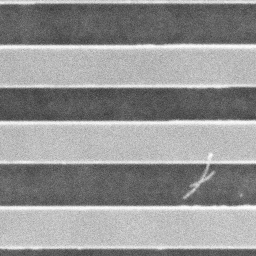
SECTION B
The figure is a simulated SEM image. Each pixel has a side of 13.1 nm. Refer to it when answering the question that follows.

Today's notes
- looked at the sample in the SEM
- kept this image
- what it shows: lines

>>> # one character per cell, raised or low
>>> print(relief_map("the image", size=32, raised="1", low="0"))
00000000000000000000000000000000
00000000000000000000000000000000
00000000000000000000000000000000
00000000000000000000000000000000
00000000000000000000000000000000
00000000000000000000000000000000
11111111111111111111111111111111
11111111111111111111111111111111
11111111111111111111111111111111
11111111111111111111111111111111
11111111111111111111111111111111
00000000000000000000000000000000
00000000000000000000000000000000
00000000000000000000000000000000
00000000000000000000000000000000
11111111111111111111111111111111
11111111111111111111111111111111
11111111111111111111111111111111
11111111111111111111111111111111
11111111111111111111111111111111
00000000000000000000000000000000
00000000000000000000000000000000
00000000000000000000000000000000
00000000000000000000000000000000
00000000000000000000000000000000
00000000000000000000000000000000
11111111111111111111111111111111
11111111111111111111111111111111
11111111111111111111111111111111
11111111111111111111111111111111
11111111111111111111111111111111
00000000000000000000000000000000